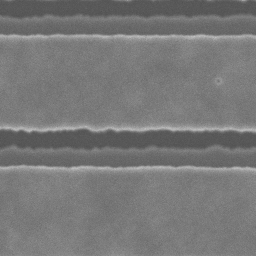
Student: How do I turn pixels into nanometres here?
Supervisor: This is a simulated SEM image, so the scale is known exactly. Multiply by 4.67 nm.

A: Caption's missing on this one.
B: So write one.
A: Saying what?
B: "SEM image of lines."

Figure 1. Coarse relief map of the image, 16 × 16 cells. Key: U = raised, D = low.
DDDDDDDDDDDDDDDD
DDDDDDDDDDDDDDDD
UUUUUUUUUUUUUUUU
UUUUUUUUUUUUUUUU
UUUUUUUUUUUUUUUU
UUUUUUUUUUUUUUUU
UUUUUUUUUUUUUUUU
UUUUUUUUUUUUUUUU
DDDDDDDDDDDDDDDD
DDDDDDDDDDDDDDDD
UUUUUUUUUUUUUUUU
UUUUUUUUUUUUUUUU
UUUUUUUUUUUUUUUU
UUUUUUUUUUUUUUUU
UUUUUUUUUUUUUUUU
UUUUUUUUUUUUUUUU